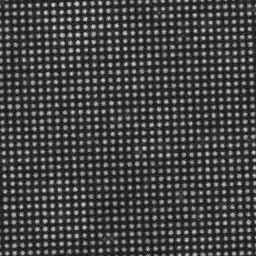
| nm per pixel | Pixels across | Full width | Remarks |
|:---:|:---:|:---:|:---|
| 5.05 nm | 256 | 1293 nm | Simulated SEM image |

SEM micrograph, a regular array of raised bodies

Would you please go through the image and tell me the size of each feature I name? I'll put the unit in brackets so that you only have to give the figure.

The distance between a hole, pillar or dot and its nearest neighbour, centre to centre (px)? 7.35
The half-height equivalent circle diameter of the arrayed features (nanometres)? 18.9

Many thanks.